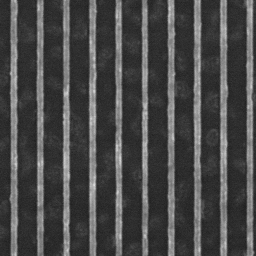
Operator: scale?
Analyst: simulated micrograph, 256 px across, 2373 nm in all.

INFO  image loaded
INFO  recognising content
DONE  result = parallel lines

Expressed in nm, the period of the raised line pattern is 243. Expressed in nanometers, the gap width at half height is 194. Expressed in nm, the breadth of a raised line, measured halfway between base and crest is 48.7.